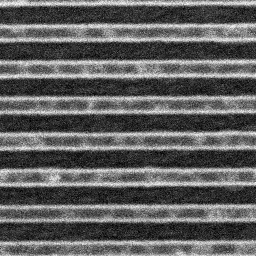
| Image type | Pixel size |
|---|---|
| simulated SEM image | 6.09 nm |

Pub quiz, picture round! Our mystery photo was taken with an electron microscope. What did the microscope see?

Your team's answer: parallel lines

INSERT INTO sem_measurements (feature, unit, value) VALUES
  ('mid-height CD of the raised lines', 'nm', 92.9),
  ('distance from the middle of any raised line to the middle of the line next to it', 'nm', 220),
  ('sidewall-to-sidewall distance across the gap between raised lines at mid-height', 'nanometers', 131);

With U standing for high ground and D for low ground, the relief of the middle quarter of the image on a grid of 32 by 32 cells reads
UUUUUUUUUUUUUUUUUUUUUUUUUUUUUUUU
UUUUUUUUUUUUUUUUUUUUUUUUUUUUUUUU
UUUUUUUUUUUUUUUUUUUUUUUUUUUUUUUU
DDDDDDDDDDDDDDDDDDDDDDDDDDDDDDDD
DDDDDDDDDDDDDDDDDDDDDDDDDDDDDDDD
DDDDDDDDDDDDDDDDDDDDDDDDDDDDDDDD
DDDDDDDDDDDDDDDDDDDDDDDDDDDDDDDD
DDDDDDDDDDDDDDDDDDDDDDDDDDDDDDDD
DUUUDDUUUUDDUUDDDUUUUDUDDUDDUDDD
UUUUUUUUUUUUUUUUUUUUUUUUUUUUUUUU
UUUUUUUUUUUUUUUUUUUUUUUUUUUUUUUU
UUUUUUUUUUUUUUUUUUUUUUUUUUUUUUUU
DDDDDDDDDDDDDDDDDDDDDDDDDDDDDDDD
DDDDDDDDDDDDDDDDDDDDDDDDDDDDDDDD
DDDDDDDDDDDDDDDDDDDDDDDDDDDDDDDD
DDDDDDDDDDDDDDDDDDDDDDDDDDDDDDDD
DDDDDDDDDDDDDDDDDDDDDDDDDDDDDDDD
DDDDDDDDDDDDDDDDDDDDDDDDDDDDDDUD
UUUUUUUUUUUUUUUUUUUUUUUUUUUUUUUU
UUUUUUUUUUUUUUUUUUUUUUUUUUUUUUUU
UUUUUUUUUUUUUUUUUUUUUUUUUUUUUUUU
DDDDDDDDDDDDDDDDDDDDDDDDDDDDDDDD
DDDDDDDDDDDDDDDDDDDDDDDDDDDDDDDD
DDDDDDDDDDDDDDDDDDDDDDDDDDDDDDDD
DDDDDDDDDDDDDDDDDDDDDDDDDDDDDDDD
DDDDDDDDDDDDDDDDDDDDDDDDDDDDDDDD
DDDDDDDDDDDDDDDDDDDDUUDDDDDUUUUU
UUUUUUUUUUUUUUUUUUUUUUUUUUUUUUUU
UUUUUUUUUUUUUUUUUUUUUUUUUUUUUUUU
UUUUUUUUUUUUUUUUUUUUUUUUUUUUUUUU
DDDDDDDDDDDDDDDDDDDDDDDDDDDDDDDD
DDDDDDDDDDDDDDDDDDDDDDDDDDDDDDDD